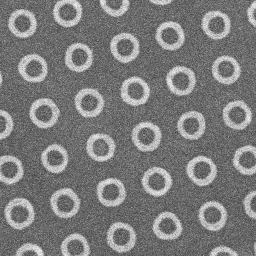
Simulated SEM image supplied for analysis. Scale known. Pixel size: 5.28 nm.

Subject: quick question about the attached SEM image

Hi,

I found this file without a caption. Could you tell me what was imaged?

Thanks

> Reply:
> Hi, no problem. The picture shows a regular array of ring-shaped raised bodies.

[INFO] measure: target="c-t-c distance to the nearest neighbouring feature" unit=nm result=241